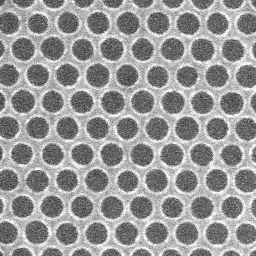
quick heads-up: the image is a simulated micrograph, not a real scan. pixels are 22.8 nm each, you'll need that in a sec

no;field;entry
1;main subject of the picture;a regular array of holes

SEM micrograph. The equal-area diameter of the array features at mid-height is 544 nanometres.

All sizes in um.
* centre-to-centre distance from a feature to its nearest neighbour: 0.672